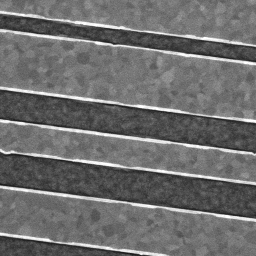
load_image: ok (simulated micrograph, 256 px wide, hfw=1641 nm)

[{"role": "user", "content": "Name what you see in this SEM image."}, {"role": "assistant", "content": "one or a few lines or trenches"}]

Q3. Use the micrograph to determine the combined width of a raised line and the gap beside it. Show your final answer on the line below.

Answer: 482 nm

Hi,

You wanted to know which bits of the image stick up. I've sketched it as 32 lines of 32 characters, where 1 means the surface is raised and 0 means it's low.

11111111111111111111111111111111
11111111111111111111111111111111
00000001111111111111111111111111
00000000000001111111111111111111
11111100000000000000001111111111
11111111111111000000000000100111
11111111111111111111100000000000
11111111111111111111111111111100
11111111111111111111111111111111
11111111111111111111111111111111
11111111111111111111111111111111
00111111111111111111111111111111
00000000001111111111111111111111
00000000000001110011111111111111
00000111000001100000000011111111
11111111000000000000000010110000
11111111111100000000000000110000
11111111111111111111000000000000
11111111111111111111111111100100
00011111111111111111111111111111
10010000000011111111111111111111
11001000000000000000111111111111
10000000000000000000000000011111
11110000000000000000000000000000
11111111110000000000000000000000
11111111111111111100000000000000
11111111111111111111111111000000
11111111111111111111111111111111
11111111111111111111111111111111
01111111111111111111111111111111
00001100111111111111111111111111
01000000000000011111111111111111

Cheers